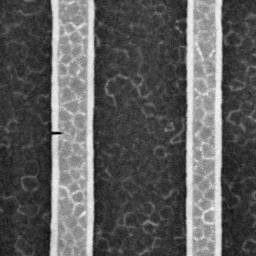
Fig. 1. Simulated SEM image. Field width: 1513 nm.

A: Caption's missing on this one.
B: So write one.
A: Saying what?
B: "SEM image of one or a few lines or trenches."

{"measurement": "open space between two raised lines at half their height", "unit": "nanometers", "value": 586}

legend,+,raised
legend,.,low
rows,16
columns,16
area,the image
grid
...+++......++..
....++......++..
....++......++..
...+++......++..
...+++......++..
...+++......++..
...+++......++..
...+++......++..
....++......++..
...+++......++..
...+++......++..
...+++......++..
...+++......++..
...+++......++..
...+++......++..
...+++......++..